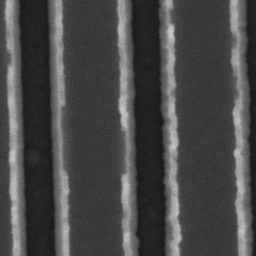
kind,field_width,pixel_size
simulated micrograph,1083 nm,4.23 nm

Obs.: one or a few lines or trenches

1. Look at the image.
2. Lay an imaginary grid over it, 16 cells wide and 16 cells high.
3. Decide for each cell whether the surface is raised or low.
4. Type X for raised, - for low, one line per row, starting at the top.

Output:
X--XXXXX--XXXXX-
X--XXXXX--XXXXX-
X--XXXXX--XXXXX-
X--XXXXX--XXXXX-
X--XXXXX--XXXXX-
X--XXXXX--XXXXX-
X--XXXXX--XXXXX-
X--XXXXX--XXXXX-
X---XXXX--XXXXX-
X---XXXX--XXXXX-
X---XXXX---XXXX-
X---XXXX--XXXXX-
X---XXXX---XXXX-
X---XXXX---XXXX-
X---XXXX---XXXX-
X---XXXX---XXXXX